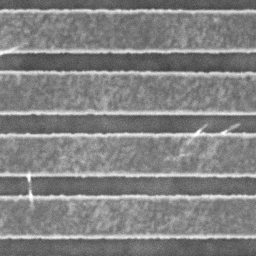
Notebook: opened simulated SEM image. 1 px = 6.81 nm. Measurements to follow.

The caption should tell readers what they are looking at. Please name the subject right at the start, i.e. lines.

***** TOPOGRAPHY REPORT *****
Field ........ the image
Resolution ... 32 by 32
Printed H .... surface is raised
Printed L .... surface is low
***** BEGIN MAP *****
LLLLLLLLLLLLLLLLLLLLLLLLLLLLLLLL
HHHHHHHHHHHHHHHHHHHHHHHHHHHHHHHH
HHHHHHHHHHHHHHHHHHHHHHHHHHHHHHHH
HHHHHHHHHHHHHHHHHHHHHHHHHHHHHHHH
HHHHHHHHHHHHHHHHHHHHHHHHHHHHHHHH
HHHHHHHHHHHHHHHHHHHHHHHHHHHHHHHH
HLLLLLLLLLLLLLLLLLLLLLLLLLLLLLLL
LLLLLLLLLLLLLLLLLLLLLLLLLLLLLLLL
LLLLLLLLLLLLLLLLLLLLLLLLLLLLLLLL
HHHHHHHHHHHHHHHHHHHHHHHHHHHHHHHH
HHHHHHHHHHHHHHHHHHHHHHHHHHHHHHHH
HHHHHHHHHHHHHHHHHHHHHHHHHHHHHHHH
HHHHHHHHHHHHHHHHHHHHHHHHHHHHHHHH
HHHHHHHHHHHHHHHHHHHHHHHHHHHHHHHH
LLLLLLLLLLLLLLLLLLLLLLLLLLLLLLLL
LLLLLLLLLLLLLLLLLLLLLLLLLLLLLLLL
LLLLLLLLLLLLLLLLLLLLLLLLLLLLLLLL
HHHHHHHHHHHHHHHHHHHHHHHHHHHHHHHH
HHHHHHHHHHHHHHHHHHHHHHHHHHHHHHHH
HHHHHHHHHHHHHHHHHHHHHHHHHHHHHHHH
HHHHHHHHHHHHHHHHHHHHHHHHHHHHHHHH
HHHHHHHHHHHHHHHHHHHHHHHHHHHHHHHH
LLLLLLLLLLLLLLLLLLLLLLLLLLLLLLLL
LLLLLLLLLLLLLLLLLLLLLLLLLLLLLLLL
LLLLLLLLLLLLLLLLLLLLLLLLLLLLLLLL
HHHHHHHHHHHHHHHHHHHHHHHHHHHHHHHH
HHHHHHHHHHHHHHHHHHHHHHHHHHHHHHHH
HHHHHHHHHHHHHHHHHHHHHHHHHHHHHHHH
HHHHHHHHHHHHHHHHHHHHHHHHHHHHHHHH
HHHHHHHHHHHHHHHHHHHHHHHHHHHHHHHH
LLLLLLLLLLLLLLLLLLLLLLLLLLLLLLLL
LLLLLLLLLLLLLLLLLLLLLLLLLLLLLLLL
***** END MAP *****